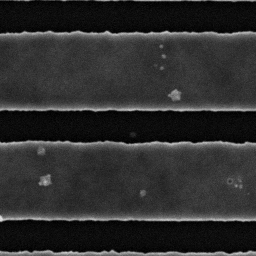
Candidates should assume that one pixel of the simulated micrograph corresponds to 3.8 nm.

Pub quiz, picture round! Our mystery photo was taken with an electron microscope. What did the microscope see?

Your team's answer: lines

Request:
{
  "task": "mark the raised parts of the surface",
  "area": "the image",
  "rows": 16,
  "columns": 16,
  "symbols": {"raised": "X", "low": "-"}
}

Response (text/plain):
----------------
----------------
XXXXXXXXXXXXXXXX
XXXXXXXXXXXXXXXX
XXXXXXXXXXXXXXXX
XXXXXXXXXXXXXXXX
XXXXXXXXXXXXXXXX
----------------
----------------
XXXXXXXXXXXXXXXX
XXXXXXXXXXXXXXXX
XXXXXXXXXXXXXXXX
XXXXXXXXXXXXXXXX
XXXXXXXXXXXXXXXX
----------------
----------------